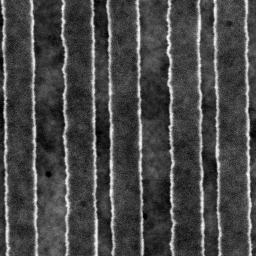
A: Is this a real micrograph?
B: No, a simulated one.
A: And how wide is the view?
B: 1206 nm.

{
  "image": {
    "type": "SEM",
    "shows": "lines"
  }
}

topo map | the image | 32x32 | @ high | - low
@@@@----@@@@-@@@@----@@@@--@@@@-
@@@@----@@@@-@@@@----@@@@--@@@@-
@@@@----@@@@--@@@----@@@@--@@@@-
@@@@----@@@@--@@@----@@@@--@@@@-
@@@@----@@@@--@@@----@@@@--@@@@-
@@@@----@@@@--@@@----@@@@--@@@@-
@@@@----@@@@--@@@----@@@@--@@@@-
@@@@----@@@@--@@@----@@@@--@@@@-
-@@@----@@@@--@@@----@@@@--@@@@-
-@@@----@@@@--@@@----@@@@--@@@@-
-@@@----@@@@--@@@----@@@@--@@@@-
-@@@----@@@@--@@@----@@@@--@@@@-
-@@@----@@@@--@@@@---@@@@--@@@@-
-@@@----@@@@--@@@----@@@@--@@@@-
-@@@----@@@@--@@@----@@@@--@@@@-
-@@@----@@@@--@@@@---@@@@--@@@@-
-@@@----@@@@--@@@@---@@@@--@@@@-
-@@@----@@@@--@@@@---@@@@--@@@@-
-@@@----@@@@--@@@@---@@@@--@@@@-
-@@@----@@@@--@@@@---@@@@--@@@@-
-@@@----@@@@--@@@@---@@@@--@@@@-
-@@@----@@@@--@@@@---@@@@--@@@@-
-@@@----@@@@--@@@@---@@@@--@@@@-
-@@@----@@@@--@@@@---@@@@--@@@@-
-@@@----@@@@--@@@@---@@@@--@@@@-
-@@@@---@@@@--@@@@---@@@@--@@@@-
-@@@@---@@@@--@@@@---@@@@--@@@@-
-@@@@---@@@@--@@@@---@@@@--@@@@-
-@@@@---@@@@--@@@@---@@@@--@@@@-
-@@@@---@@@@--@@@@---@@@@@-@@@@-
-@@@@---@@@@--@@@@---@@@@--@@@@-
-@@@@---@@@@--@@@@---@@@@@-@@@@-